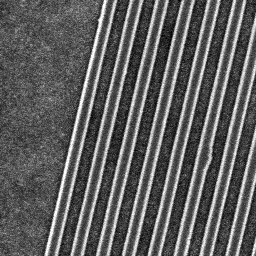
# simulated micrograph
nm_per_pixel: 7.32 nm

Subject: parallel lines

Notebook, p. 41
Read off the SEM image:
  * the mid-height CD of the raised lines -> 75.7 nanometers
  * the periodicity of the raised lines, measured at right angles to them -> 184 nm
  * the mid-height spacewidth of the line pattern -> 110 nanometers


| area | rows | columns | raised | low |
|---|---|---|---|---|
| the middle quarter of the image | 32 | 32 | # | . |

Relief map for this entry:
......###....##....###....##....
......###....##....###....##....
......###...###....###...###....
......##....###....##....###....
.....###....###...###....###...#
.....###....##....###....##....#
.....###....##....###....##....#
.....##....###....##....###....#
.....##....###....##....###....#
....###....##....###....##....##
....###....##....###....##....##
....##....###....##....###....##
....##....###....##....###....##
...###....##....###....##....###
...###....##....###....##....###
...###...###....##....###....##.
...##....###....##....###....##.
..###....###...###....###...###.
..###....##....###....##....###.
..###...###....###...###....###.
..##....###....##....###....##..
..##....###....##....###....##..
.###....##....###....##....###..
.###....##....###....##....###..
.##....###....##....###....##...
.##....###....##....###....##...
###....###...###....##....###...
###....##....###....##....###...
##....###....##....###....##....
##....###....##....###....##....
##....###...###....##....###....
##....##....###....##....###....